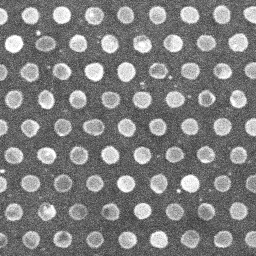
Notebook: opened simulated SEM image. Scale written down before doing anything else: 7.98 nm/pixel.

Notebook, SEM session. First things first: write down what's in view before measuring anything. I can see a regular array of raised bodies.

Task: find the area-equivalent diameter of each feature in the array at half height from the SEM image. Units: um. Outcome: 0.131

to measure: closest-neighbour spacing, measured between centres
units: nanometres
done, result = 250